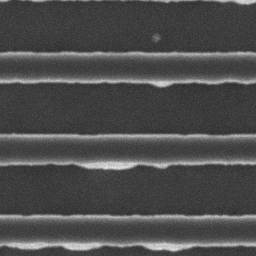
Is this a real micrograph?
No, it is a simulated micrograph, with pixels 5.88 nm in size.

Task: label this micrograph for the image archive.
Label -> lines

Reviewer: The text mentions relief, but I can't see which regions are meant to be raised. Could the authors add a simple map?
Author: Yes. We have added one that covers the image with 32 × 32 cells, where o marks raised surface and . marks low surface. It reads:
................................
................................
................................
................................
................................
................................
................................
oooooooooooooooooooooooooooooooo
oooooooooooooooooooooooooooooooo
oooooooooooooooooooooooooooooooo
................................
................................
................................
................................
................................
................................
................................
oooooooooooooooooooooooooooooooo
oooooooooooooooooooooooooooooooo
oooooooooooooooooooooooooooooooo
oooooooooooooooooooooooooo..o..o
................................
................................
................................
................................
................................
................................
oooooooooooooooooooooooooooooooo
oooooooooooooooooooooooooooooooo
oooooooooooooooooooooooooooooooo
oooooooooooooooooooooooooooooooo
................................